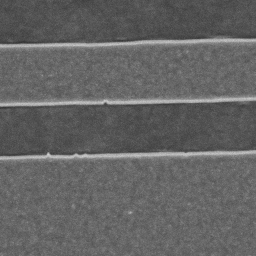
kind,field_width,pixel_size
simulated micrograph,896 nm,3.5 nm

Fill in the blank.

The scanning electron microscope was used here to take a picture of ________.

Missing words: one or a few lines or trenches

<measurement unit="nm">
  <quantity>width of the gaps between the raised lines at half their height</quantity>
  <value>180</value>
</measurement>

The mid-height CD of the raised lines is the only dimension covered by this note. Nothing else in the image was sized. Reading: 211 nm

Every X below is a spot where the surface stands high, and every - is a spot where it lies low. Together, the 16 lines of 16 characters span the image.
----------------
----------------
--------------XX
XXXXXXXXXXXXXXXX
XXXXXXXXXXXXXXXX
XXXXXXXXXXXXXXXX
XXXX------------
----------------
----------------
----------------
XXXXXXXXXXXXXXXX
XXXXXXXXXXXXXXXX
XXXXXXXXXXXXXXXX
XXXXXXXXXXXXXXXX
XXXXXXXXXXXXXXXX
XXXXXXXXXXXXXXXX